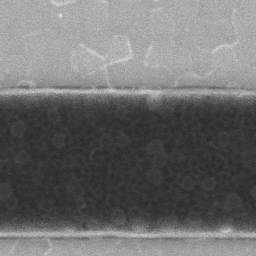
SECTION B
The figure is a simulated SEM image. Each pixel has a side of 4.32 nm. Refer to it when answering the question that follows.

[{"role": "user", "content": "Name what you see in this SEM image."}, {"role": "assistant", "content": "one or a few lines or trenches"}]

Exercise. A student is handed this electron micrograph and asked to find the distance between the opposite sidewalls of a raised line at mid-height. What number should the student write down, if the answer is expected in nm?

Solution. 630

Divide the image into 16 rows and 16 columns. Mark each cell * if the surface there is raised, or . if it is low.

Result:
................
................
................
................
................
................
****************
****************
****************
****************
****************
****************
****************
****************
****************
................